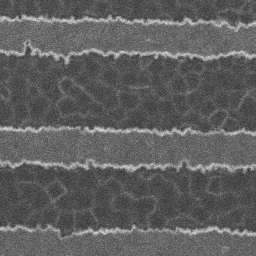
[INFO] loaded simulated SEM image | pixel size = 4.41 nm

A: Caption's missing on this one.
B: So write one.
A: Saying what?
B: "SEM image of one or a few lines or trenches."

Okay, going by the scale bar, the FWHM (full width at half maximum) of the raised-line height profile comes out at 164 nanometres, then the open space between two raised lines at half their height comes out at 296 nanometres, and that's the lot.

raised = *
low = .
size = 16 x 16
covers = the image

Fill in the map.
................
**************.*
****************
...**.....****.*
................
................
................
................
****************
****************
*...*..**...*.**
................
................
................
****.**********.
****************